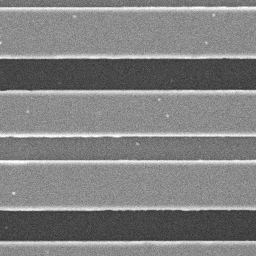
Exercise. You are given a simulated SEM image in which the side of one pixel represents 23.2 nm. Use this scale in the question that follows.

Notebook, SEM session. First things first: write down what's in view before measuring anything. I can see lines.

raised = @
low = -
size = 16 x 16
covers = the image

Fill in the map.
@@@@@@@@@@@@@@@@
@@@@@@@@@@@@@@@@
@@@@@@@@@@@@@@@@
@@@@@@@@@@@@@@@@
----------------
----------------
@@@@@@@@@@@@@@@@
@@@@@@@@@@@@@@@@
@@@@@@@@@@@@@@@@
@@@@@@@@@@@@@@@@
@@@@@@@@@@@@@@@@
@@@@@@@@@@@@@@@@
@@@@@@@@@@@@@@@@
----------------
----------------
@@@@@@@@@@@@@@@@